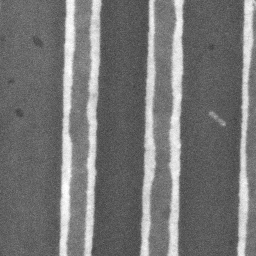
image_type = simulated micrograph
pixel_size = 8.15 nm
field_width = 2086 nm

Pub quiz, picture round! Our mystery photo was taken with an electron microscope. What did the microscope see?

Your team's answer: lines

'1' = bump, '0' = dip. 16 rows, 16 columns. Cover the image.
0000110001100001
0000110001100001
0000110001100001
0000110001100001
0000110001100001
0000110001100001
0000110001100001
0000110001100001
0000110001100001
0000110001100001
0000110001100001
0000110001100001
0000110001100001
0000110001100001
0000110001100001
0000110001100001